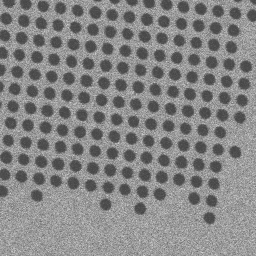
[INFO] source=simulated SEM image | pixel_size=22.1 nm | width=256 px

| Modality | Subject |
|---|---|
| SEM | a regular array of holes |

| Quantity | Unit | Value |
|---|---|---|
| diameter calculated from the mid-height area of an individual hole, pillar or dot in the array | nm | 270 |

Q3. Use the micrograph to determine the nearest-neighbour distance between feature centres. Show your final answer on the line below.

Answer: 376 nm